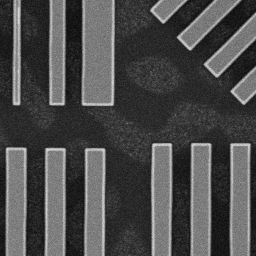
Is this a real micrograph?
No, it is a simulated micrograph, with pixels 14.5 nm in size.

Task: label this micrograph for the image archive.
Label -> groups of lines, slits or small figures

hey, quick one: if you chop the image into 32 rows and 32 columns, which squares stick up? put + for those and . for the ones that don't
......++..++++......+++...++++..
......++..++++.....+++...++++...
......++..++++......+...++++...+
......++..++++.........++++...++
......++..++++........++++...+++
......++..++++.........++...+++.
......++..++++.............+++..
......++..++++............+++...
......++..++++............++....
......++..++++.................+
......++..++++................++
......++..++++...............+++
......++..++++................+.
................................
................................
................................
................................
................................
...................++...++...++.
.++...++...++......++...++...++.
.++...++...++......++...++...++.
.++...++...++......++...++...++.
.++...++...++......++...++...++.
.++...++...++......++...++...++.
.++...++...++......++...++...++.
.++...++...++......++...++...++.
.++...++...++......++...++...++.
.++...++...++......++...++...++.
.++...++...++......++...++...++.
.++...++...++......++...++...++.
.++...++...++......++...++...++.
.++...++...++......++...++...++.